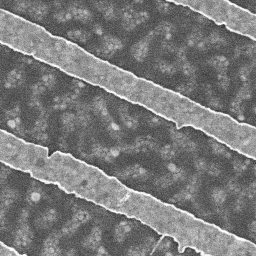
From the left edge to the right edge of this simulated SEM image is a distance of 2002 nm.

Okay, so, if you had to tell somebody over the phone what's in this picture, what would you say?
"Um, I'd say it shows one or a few lines or trenches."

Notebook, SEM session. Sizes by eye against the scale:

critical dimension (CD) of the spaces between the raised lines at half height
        612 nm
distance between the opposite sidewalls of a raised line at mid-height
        216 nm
